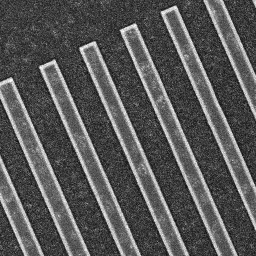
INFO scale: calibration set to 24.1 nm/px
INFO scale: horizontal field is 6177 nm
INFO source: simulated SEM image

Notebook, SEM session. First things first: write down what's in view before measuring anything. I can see parallel lines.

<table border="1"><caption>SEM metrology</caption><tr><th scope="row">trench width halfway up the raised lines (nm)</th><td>702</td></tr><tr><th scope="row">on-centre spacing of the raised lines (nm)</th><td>1070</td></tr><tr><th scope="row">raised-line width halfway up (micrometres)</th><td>0.362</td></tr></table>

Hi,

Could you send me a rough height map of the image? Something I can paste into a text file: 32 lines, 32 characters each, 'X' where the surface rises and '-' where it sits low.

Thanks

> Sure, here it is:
--------------------------XX----
---------------------X----XX----
---------------------XX----XX---
----------------X----XX----XX---
---------------XX-----X-----XX--
----------------XX----XX----XX--
----------XX----XX----XX----XX--
-----------XX----XX----XX----XX-
-----XX----XX----XX----XX----XX-
-----XXX----XX----XX----XX----XX
XX----XX----XX----XX----XX----XX
XX----XXX---XXX---XXX----XX----X
XXX----XX----XX----XX----XX----X
-XX----XX----XX----XX----XX-----
-XX-----XX----XX----XX----XX----
--XX----XX----XX----XX----XX----
--XX-----XX----XX----XX----XX---
---XX----XX----XX----XX----XX---
---XX----XXX----XX----XX----XX--
---XXX----XX----XX----XX----XX--
----XX----XX----XX----XX-----XX-
X---XX-----XX----XX----XX----XX-
X----XX----XX----XX----XX----XX-
XX---XX-----XX----XX----XX----XX
XX---XXX----XX----XX----XX----XX
XX----XX----XXX----XX----XX----X
-XX---XXX----XX----XX----XX----X
-XX----XX----XXX---XXX---XXX----
--XX---XXX----XX----XX----XX----
--XX----XX----XX----XX----XX----
---XX---XX-----XX----XX----XX---
---XX----XX----XX----XX----XX---